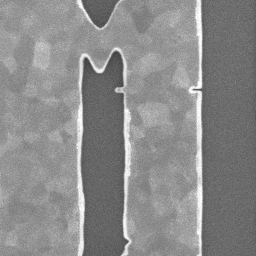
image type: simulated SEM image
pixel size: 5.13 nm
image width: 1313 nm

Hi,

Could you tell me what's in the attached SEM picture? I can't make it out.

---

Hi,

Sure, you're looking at one or a few lines or trenches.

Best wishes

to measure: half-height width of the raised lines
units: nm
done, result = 386